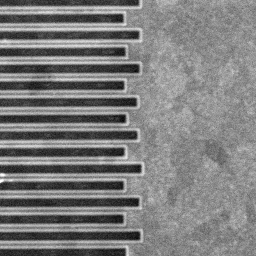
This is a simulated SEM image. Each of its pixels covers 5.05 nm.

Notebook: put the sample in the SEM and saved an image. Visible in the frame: parallel lines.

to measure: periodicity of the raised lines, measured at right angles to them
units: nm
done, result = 84.6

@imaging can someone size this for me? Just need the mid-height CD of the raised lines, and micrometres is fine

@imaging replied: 0.0354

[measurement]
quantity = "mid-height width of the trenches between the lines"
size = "49.2 nm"